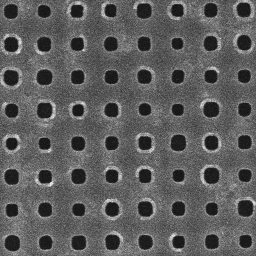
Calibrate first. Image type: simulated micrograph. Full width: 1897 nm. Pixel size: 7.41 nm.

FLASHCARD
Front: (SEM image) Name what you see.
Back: a regular array of holes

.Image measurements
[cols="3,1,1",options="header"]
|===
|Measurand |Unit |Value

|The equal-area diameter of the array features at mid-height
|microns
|0.109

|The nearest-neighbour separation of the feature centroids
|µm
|0.244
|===